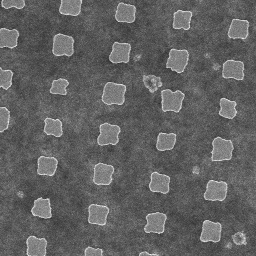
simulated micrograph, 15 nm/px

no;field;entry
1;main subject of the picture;a regular array of raised bodies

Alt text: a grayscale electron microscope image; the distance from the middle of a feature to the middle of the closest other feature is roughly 0.609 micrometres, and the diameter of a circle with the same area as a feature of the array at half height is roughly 319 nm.